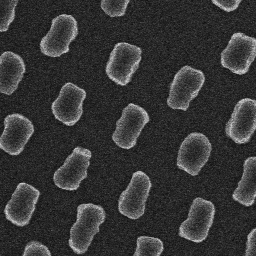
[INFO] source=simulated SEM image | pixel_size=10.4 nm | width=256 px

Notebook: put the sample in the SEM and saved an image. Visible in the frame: a regular array of raised bodies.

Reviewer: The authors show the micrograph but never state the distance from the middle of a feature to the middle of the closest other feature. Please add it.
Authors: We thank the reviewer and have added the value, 64.3 px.